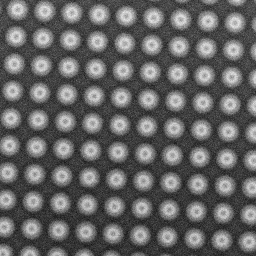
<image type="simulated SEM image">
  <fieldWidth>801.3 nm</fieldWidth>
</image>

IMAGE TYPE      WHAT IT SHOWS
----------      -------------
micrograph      an array of small figures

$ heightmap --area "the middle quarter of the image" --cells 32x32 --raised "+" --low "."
++++..++++...++++...++++...+++..
++++.+++++..+++++..+++++..+++++.
+++...++++..+++++..+++++..+++++.
.......++....++++..+++++..+++++.
.....................+.....+++..
++..............................
+++...++++...+++....++..........
+++..+++++..+++++..++++...++++..
+++..+++++..+++++..+++++..++++..
+++..+++++..+++++..+++++..++++..
.............+++...++++...++++..
...........................++...
++....++........................
+++..++++...++++...+++..........
+++..+++++..++++...++++...++++..
+++..+++++.+++++..+++++..+++++..
++...++++...++++..+++++..+++++..
.............++....+++....++++..
...........................+....
++...+++........................
++...++++..++++....+++....++....
++..+++++..+++++..+++++..++++...
++..+++++..+++++..+++++..+++++.+
+....+++....++++..+++++..++++..+
.............+.....+++...++++...
................................
++...+++....++..................
++..+++++..++++...++++...+++....
++..+++++..+++++..++++..+++++..+
++..+++++..+++++.+++++..+++++..+
.....+++...++++...++++..+++++..+
...................++....+++...+